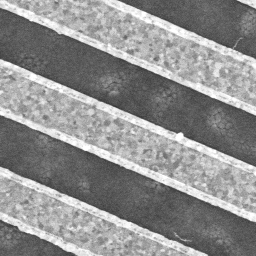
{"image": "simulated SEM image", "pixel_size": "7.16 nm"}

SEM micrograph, one or a few lines or trenches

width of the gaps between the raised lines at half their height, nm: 375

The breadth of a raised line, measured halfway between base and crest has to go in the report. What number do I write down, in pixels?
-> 46.7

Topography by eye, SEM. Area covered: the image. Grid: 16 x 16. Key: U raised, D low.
DUUUUUUUDDDDDDDD
DDDUUUUUUUDDDDDD
DDDDDUUUUUUUUDDD
DDDDDDDDUUUUUUUD
UDDDDDDDDDUUUUUU
UUUUDDDDDDDDUUUU
UUUUUUDDDDDDDDDU
DUUUUUUUUDDDDDDD
DDDDUUUUUUUDDDDD
DDDDDDUUUUUUUDDD
DDDDDDDDUUUUUUUU
UUDDDDDDDDUUUUUU
UUUUUDDDDDDDDUUU
UUUUUUUDDDDDDDDU
DDUUUUUUUDDDDDDD
DDDDUUUUUUUDDDDD